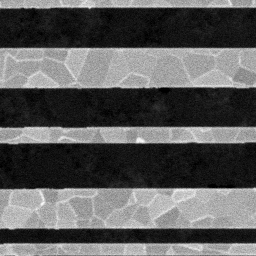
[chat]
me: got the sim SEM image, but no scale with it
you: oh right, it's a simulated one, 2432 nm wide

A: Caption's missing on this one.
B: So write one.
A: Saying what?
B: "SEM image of lines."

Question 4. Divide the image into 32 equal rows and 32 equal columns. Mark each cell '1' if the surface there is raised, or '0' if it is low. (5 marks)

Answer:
11111111111111111111111111111111
00000000000000000000000000000000
00000000000000000000000000000000
00000000000000000000000000000000
00000000000000000000000000000000
00000000000000000000000000000000
11111111111111111111111111111111
11111111111111111111111111111111
11111111111111111111111111111111
11111111111111111111111111111111
11111111111111111111111111111111
00000000000000000000000000000000
00000000000000000000000000000000
00000000000000000000000000000000
00000000000000000000000000000000
00000000000000000000000000000000
11111111111111111111111111111111
11111111111111111111111111111111
00000000000000000000000000000000
00000000000000000000000000000000
00000000000000000000000000000000
00000000000000000000000000000000
00000000000000000000000000000000
00000000000000000000000000000000
11111111111111111111111111111111
11111111111111111111111111111111
11111111111111111111111111111111
11111111111111111111111111111111
11000011000000000000000000000000
00000000000000000000000000000000
00000000000000000000000000000100
11111111111111111111111111111111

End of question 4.